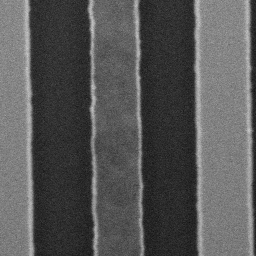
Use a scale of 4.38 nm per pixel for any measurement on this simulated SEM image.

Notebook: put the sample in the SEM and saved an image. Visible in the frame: lines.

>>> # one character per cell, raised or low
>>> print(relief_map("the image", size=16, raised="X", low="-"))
XX----XXX---XXXX
XX----XXX---XXXX
XX----XXX---XXXX
XX----XXX---XXXX
XX----XXX---XXXX
XX----XXX---XXXX
XX----XXX---XXXX
XX----XXX---XXXX
XX----XXX---XXXX
XX----XXX---XXXX
XX----XXX---XXXX
XX----XXX---XXXX
XX----XXX---XXXX
XX----XXX---XXXX
XX----XXX---XXXX
XX----XXX---XXXX